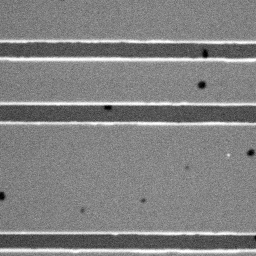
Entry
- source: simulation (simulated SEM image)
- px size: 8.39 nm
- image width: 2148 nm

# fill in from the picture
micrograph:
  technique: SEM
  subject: lines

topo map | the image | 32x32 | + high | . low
++++++++++++++++++++++++++++++++
++++++++++++++++++++++++++++++++
++++++++++++++++++++++++++++++++
++++++++++++++++++++++++++++++++
++++++++++++++++++++++++++++++++
................................
................................
+++++++++++++++++++++++++++++..+
++++++++++++++++++++++++++++++++
++++++++++++++++++++++++++++++++
++++++++++++++++++++++++++++++++
++++++++++++++++++++++++++++++++
++++++++++++++++++++++++++++++++
................................
................................
++++++++++++++++++++++++++++++++
++++++++++++++++++++++++++++++++
++++++++++++++++++++++++++++++++
++++++++++++++++++++++++++++++++
++++++++++++++++++++++++++++++++
++++++++++++++++++++++++++++++++
++++++++++++++++++++++++++++++++
++++++++++++++++++++++++++++++++
++++++++++++++++++++++++++++++++
++++++++++++++++++++++++++++++++
++++++++++++++++++++++++++++++++
++++++++++++++++++++++++++++++++
++++++++++++++++++++++++++++++++
++++++++++++++++++++++++++++++++
................................
................................
++++++++++++++++++++++++++++++++